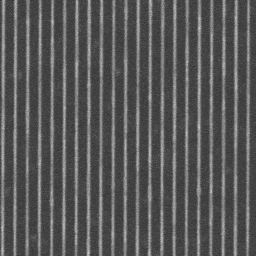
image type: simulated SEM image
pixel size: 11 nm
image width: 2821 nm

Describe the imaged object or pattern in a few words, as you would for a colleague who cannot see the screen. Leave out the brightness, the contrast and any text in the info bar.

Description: parallel lines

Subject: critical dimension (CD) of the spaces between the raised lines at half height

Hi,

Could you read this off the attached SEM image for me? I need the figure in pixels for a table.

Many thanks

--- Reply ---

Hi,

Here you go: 10.6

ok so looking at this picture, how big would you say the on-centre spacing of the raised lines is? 135 nanometres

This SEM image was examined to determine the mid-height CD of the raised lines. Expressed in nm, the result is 22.